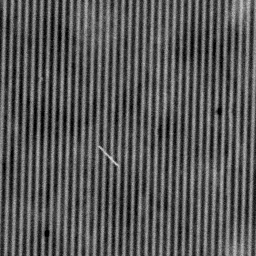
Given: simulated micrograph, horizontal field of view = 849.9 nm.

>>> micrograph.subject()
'parallel lines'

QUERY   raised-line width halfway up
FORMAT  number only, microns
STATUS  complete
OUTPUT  0.0099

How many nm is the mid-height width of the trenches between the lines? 14.5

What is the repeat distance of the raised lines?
24.5 nm